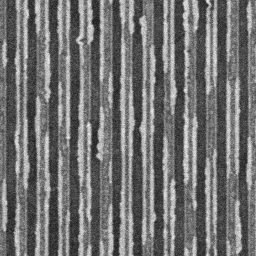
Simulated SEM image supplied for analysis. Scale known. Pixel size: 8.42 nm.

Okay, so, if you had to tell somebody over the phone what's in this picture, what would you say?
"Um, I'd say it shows parallel lines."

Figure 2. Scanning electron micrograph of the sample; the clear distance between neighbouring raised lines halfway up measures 82.1 nanometres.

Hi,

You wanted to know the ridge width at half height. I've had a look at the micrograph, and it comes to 10.6 pixels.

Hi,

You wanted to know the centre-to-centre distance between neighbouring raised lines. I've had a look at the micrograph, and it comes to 0.178 µm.